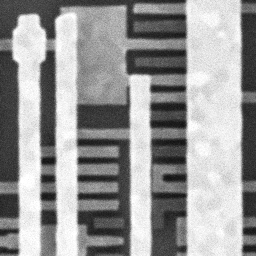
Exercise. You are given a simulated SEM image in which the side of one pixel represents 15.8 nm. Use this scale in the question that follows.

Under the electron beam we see wiring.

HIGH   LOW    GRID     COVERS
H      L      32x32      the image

LLLLLLLLLLLLLLLLLLLLLLLHHHHHHHLL
LLLLLLLLLLLLLLLLLLLLLLLHHHHHHHLL
LLHHHLLHHLLLLLLLLLLLLLLHHHHHHHLL
LLHHHLLHHLLLLLLLLLLLLLLHHHHHHHLL
LLHHHHLHHLLLLLLLLLLLLLLHHHHHHHLL
LLHHHHLHHLLLLLLLLLLLLLLHHHHHHHLL
LLHHHHLHHLLLLLLLLLLLLLLHHHHHHHLL
LLHHHLLHHLLLLLLLLLLLLLLHHHHHHHLL
LLHHHLLHHLLLLLLLLLLLLLLHHHHHHHLL
LLHHHLLHHLLLLLLLLHLLLLLHHHHHHHLL
LLHHHLLHHLLLLLLLHHHLLLLHHHHHHHLL
LLLHHLLHHLLLLLLLHHHLLLLHHHHHHHLL
LLLHHLLHHLLLLLLLHHHLLLLHHHHHHHLL
LLLHHLLHHLLLLLLLHHHLLLLHHHHHHHLL
LLLHHLLHHLLLLLLLHHHLLLLHHHHHHHLL
LLLHHLLHHLLLLLLLHHHLLLLHHHHHHHLL
LLLHHLLHHLLLLLLLHHHLLLLHHHHHHHLL
LLLHHLLHHLLLLLLLHHHLLLLHHHHHHHLL
LLLHHLLHHLLLLLLLHHHLLLLHHHHHHHLL
LLLHHLLHHLLLLLLLHHHLLLLHHHHHHHLL
LLLHHLLHHLLLLLLLHHHLLLLHHHHHHHLL
LLLHHLLHHLLLLLLLHHHLLLLHHHHHHHLL
LLLHHLLHHLLLLLLLHHHLLLLHHHHHHHLL
LLLHHLLHHLLLLLLLHHHLLLLLHHHHHHLL
LLLHHLLHHLLLLLLLHHHLLLLHHHHHHHLL
LLLHHLLHHLLLLLLLHHHLLLLHHHHHHHLL
LLLHHLLHHLLLLLLLHHHLLLLHHHHHHHLL
LLLHHLLHHLLLLLLLHHHLLLLHHHHHHHLL
LLLHHLLHHLLLLLLLHHHLLLLHHHHHHHLL
LLLHHLLHHLLLLLLLHHHLLLLHHHHHHHLL
LLLHHLLHHHLLLLLLHHHLLLLLHHHHHHLL
LLLHHLLHHHLLLLLLHHHLLLLHHHHHHHLL